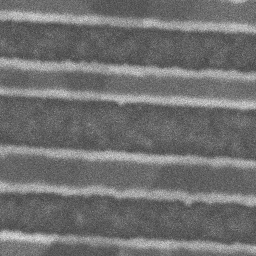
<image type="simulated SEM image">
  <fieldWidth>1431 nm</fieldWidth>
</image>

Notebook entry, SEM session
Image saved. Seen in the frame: one or a few lines or trenches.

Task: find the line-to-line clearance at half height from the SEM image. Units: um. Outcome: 0.26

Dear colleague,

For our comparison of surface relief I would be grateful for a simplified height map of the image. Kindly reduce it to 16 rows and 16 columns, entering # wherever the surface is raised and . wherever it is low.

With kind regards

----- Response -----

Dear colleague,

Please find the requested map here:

################
........########
................
................
############....
################
..............##
................
................
####............
################
################
..............##
................
................
################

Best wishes